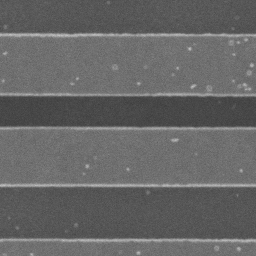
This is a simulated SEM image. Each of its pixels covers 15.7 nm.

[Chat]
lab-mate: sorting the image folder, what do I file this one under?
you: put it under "lines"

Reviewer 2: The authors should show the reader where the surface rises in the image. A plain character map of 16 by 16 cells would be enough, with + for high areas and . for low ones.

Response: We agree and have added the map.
................
................
++++++++++++++++
++++++++++++++++
++++++++++++++++
++++++++++++++++
................
................
++++++++++++++++
++++++++++++++++
++++++++++++++++
++++++++++++++++
................
................
................
++++++++++++++++